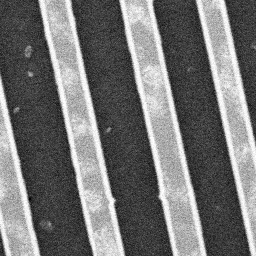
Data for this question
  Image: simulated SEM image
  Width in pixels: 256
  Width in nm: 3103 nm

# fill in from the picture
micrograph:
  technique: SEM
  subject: one or a few lines or trenches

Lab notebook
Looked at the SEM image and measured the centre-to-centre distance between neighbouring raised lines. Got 945 nm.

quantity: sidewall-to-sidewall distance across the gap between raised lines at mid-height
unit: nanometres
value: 641